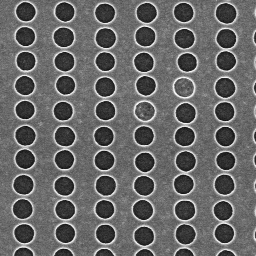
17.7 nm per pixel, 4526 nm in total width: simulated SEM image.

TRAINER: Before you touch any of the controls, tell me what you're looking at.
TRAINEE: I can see a regular array of holes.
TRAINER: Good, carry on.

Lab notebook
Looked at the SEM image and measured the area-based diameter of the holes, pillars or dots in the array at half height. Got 354 nm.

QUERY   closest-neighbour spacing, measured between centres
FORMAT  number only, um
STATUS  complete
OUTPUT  0.423